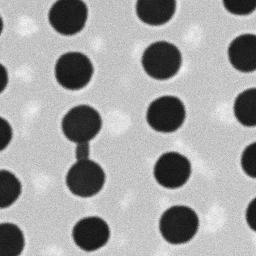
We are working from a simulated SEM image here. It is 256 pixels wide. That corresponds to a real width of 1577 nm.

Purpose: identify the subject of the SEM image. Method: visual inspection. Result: holes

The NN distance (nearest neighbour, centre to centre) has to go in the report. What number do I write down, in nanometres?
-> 338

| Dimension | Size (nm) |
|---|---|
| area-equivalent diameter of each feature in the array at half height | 243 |